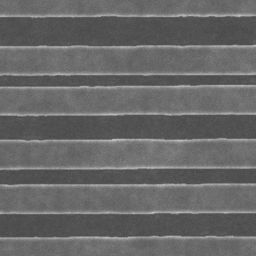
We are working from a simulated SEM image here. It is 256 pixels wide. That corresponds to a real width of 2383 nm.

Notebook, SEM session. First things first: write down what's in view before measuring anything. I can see lines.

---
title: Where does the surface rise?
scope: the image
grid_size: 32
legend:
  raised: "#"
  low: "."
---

################################
################################
................................
................................
................................
................................
################################
################################
################################
................................
................................
################################
################################
################################
................................
................................
................................
..............######....########
################################
################################
################################
................................
................................
################################
################################
################################
################################
................................
................................
................................
################################
################################